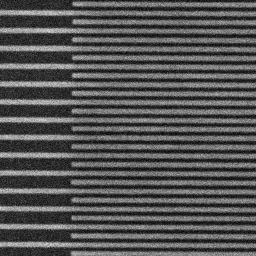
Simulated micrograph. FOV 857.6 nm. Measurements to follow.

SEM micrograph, parallel lines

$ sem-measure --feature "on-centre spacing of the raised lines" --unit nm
29.9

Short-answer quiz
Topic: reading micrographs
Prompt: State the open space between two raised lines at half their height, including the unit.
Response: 15.1 nm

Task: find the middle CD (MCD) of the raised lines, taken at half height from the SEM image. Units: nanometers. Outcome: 15.1